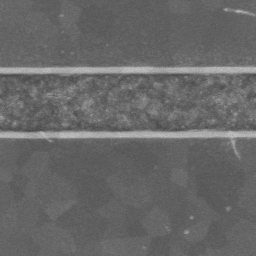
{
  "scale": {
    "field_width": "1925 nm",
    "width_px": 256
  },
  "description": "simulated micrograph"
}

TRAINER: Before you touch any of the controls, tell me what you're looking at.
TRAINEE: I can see one or a few lines or trenches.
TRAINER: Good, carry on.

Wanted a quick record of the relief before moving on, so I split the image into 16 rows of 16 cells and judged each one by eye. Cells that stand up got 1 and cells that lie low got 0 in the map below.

1111111111111111
1111111111111111
1111111111111111
1111111111111111
0000000000000000
0000000000000000
0000000000000000
0000000000000000
1111111111111111
1111111111111111
1111111111111111
1111111111111111
1111111111111111
1111111111111111
1111111111111111
1111111111111111